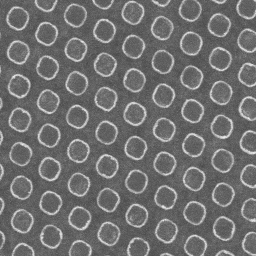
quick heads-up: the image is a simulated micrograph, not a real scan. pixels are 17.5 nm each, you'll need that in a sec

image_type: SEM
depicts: a regular array of raised bodies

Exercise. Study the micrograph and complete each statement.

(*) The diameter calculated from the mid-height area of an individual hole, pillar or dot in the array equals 383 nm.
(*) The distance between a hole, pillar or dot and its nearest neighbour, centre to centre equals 32.9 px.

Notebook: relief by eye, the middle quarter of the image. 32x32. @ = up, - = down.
--------@@@@@---------@@@@@-----
--------@@@@----@@-----@@@----@@
--@@-----@@@---@@@@@---------@@@
-@@@@@---------@@@@@---------@@@
-@@@@@---------@@@@@----------@@
-@@@@@---------@@@@@---@@@----@@
-@@@@----@@@-----@@----@@@@-----
--@@----@@@@@---------@@@@@@----
--------@@@@@---------@@@@@@----
--------@@@@@----------@@@@----@
---@-----@@@@---@@@-----@@----@@
--@@@------@----@@@@----------@@
-@@@@@---------@@@@@----------@@
-@@@@@---------@@@@@----------@@
-@@@@@----@-----@@@----@@@@-----
--@@@----@@@@----------@@@@@----
--------@@@@@---------@@@@@@----
--------@@@@@----------@@@@-----
--------@@@@@----@@----@@@@---@@
--@@@----@@@----@@@@----------@@
-@@@@@---------@@@@@@---------@@
-@@@@@---------@@@@@----------@@
-@@@@@----------@@@@----@@-----@
--@@@@---@@@@----@@----@@@@-----
---@-----@@@@----------@@@@@----
--------@@@@@@---------@@@@@----
--------@@@@@----------@@@@----@
---@-----@@@@---@@@@----@@----@@
--@@@@----------@@@@@---------@@
-@@@@@----------@@@@@---------@@
-@@@@@----------@@@@-----------@
-@@@@@----@@-----@@@----@@@-----